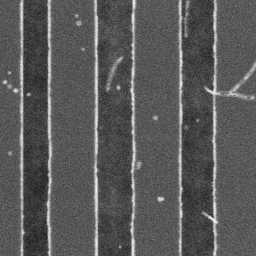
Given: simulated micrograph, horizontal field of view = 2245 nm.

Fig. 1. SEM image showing lines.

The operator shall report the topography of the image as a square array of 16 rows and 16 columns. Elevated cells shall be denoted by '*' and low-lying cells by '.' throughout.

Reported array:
*..***..***..***
*..***..***..***
*..***..***..***
*..***..***..***
*..***..***..***
*..***..***..***
*..***..***..***
*..***..***..***
*..***..***..***
*..***..***..***
*..***..***..***
*..***..***..***
*..***..***..***
*..***..***..***
*..***..***..***
*..***..***..***